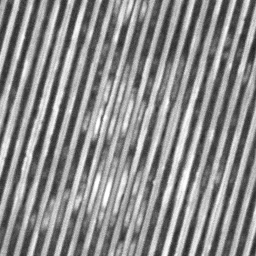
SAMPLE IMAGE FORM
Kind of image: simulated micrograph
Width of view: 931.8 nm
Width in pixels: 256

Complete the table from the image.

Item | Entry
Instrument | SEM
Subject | parallel lines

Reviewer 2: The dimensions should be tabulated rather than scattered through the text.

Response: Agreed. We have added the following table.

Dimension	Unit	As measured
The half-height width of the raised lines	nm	15.4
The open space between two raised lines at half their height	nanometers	30.8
